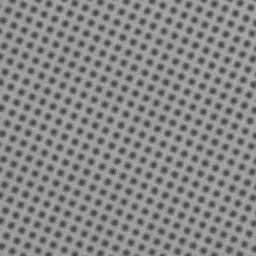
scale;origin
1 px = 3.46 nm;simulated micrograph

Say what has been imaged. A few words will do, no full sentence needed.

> a regular array of holes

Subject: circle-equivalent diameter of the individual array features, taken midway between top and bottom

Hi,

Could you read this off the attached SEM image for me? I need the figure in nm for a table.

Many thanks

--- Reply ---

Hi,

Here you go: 24.1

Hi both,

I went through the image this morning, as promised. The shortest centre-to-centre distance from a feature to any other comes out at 0.0391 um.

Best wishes